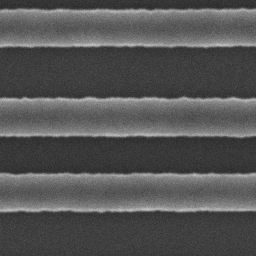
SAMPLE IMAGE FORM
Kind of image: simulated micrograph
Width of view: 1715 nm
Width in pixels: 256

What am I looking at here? lines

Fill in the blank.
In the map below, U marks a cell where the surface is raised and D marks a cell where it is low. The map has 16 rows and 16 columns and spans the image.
DDDDDDDDDDDDDDDD
UUUUUUUUUUUUUUUU
UUUUUUUUUUUUUUUU
DDDDDDDDDDDDDDDD
DDDDDDDDDDDDDDDD
DDDDDDDDDDDDDDDD
UUUUUUUUUUUUUUUU
UUUUUUUUUUUUUUUU
UUDDDDDUDDDDDDUU
DDDDDDDDDDDDDDDD
DDDDDDDDDDDDDDDD
UUUUUUUUUUUUUUUU
UUUUUUUUUUUUUUUU
DDDDDDDDDDDDDDDD
DDDDDDDDDDDDDDDD
DDDDDDDDDDDDDDDD